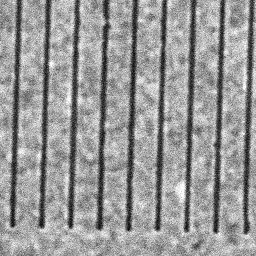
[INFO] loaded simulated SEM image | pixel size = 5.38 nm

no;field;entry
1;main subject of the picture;parallel lines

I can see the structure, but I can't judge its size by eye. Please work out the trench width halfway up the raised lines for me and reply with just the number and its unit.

36.9 nm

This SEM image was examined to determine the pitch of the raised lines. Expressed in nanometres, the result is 156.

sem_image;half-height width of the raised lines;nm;121